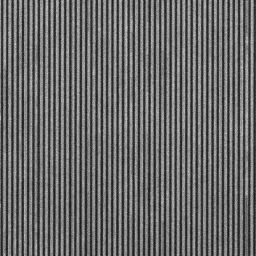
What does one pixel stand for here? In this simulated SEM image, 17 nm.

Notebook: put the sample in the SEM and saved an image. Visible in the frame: parallel lines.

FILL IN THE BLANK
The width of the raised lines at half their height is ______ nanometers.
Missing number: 34.1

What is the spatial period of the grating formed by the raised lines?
0.0898 µm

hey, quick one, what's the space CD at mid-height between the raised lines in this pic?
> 51.1 nm